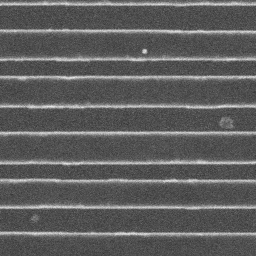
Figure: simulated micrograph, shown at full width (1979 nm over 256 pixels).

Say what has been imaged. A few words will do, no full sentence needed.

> lines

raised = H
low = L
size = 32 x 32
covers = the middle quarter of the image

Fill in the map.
LLLLLLLLLLLLLLLLLLLLLLLLLLLLLLLL
LLLLLLLLLLLLLLLLLLLLLLLLLLLLLLLL
LLLLLLLLLLLLLLLLLLLLLLLLLLLLLLLL
HHHHHHHHHHHHHHHHHHHHHHHHHHHHHHHH
HHHHHHHHHHHHHHHHHHHHHHHHHHHHHHHH
HHHHHHHHHHHHHHHHHHHHHHHHHHHHHHHH
HHHHHHHHHHHHHHHHHHHHHHHHHHHHHHHH
HHHHHHHHHHHHHHHHHHHHHHHHHHHHHHHH
HHHHHHHHHHHHHHHHHHHHHHHHHHHHHHHH
HHHHHHHHHHHHHHHHHHHHHHHHHHHHHHHH
HHHHHHHHHHHHHHHHHHHHHHHHHHHHHHHH
LLLLLLLLLLLLLLLLLLLLLLLLLLLLLLLL
LLLLLLLLLLLLLLLLLLLLLLLLLLLLLLLL
LLLLLLLLLLLLLLLLLLLLLLLLLLLLLLLL
LLLLLLLLLLLLLLLLLLLLLLLLLLLLLLLL
LLLLLLLLLLLLLLLLLLLLLLLLLLLLLLLL
LLLLLLLLLLLLLLLLLLLLLLLLLLLLLLLL
HHHHHHHHHHHHHHHHHHHHHHHHHHHHHHHH
HHHHHHHHHHHHHHHHHHHHHHHHHHHHHHHH
HHHHHHHHHHHHHHHHHHHHHHHHHHHHHHHH
HHHHHHHHHHHHHHHHHHHHHHHHHHHHHHHH
HHHHHHHHHHHHHHHHHHHHHHHHHHHHHHHH
HHHHHHHHHHHHHHHHHHHHHHHHHHHHHHHH
HHHHHHHHHHHHHHHHHHHHHHHHHHHHHHHH
HHHHHHHHHHHHHHHHHHHHHHHHHHHHHHHH
LLLLLLLLLLLLLLLLLLLLLLLLLLLLLLLL
LLLLLLLLLLLLLLLLLLLLLLLLLLLLLLLL
LLLLLLLLLLLLLLLLLLLLLLLLLLLLLLLL
LLLLLLLLLLLLLLLLLLLLLLLLLLLLLLLL
HHHHHHHHHHHHHHHHHHHHHHHHHHHHHHHH
HHHHHHHHHHHHHHHHHHHHHHHHHHHHHHHH
HHHHHHHHHHHHHHHHHHHHHHHHHHHHHHHH